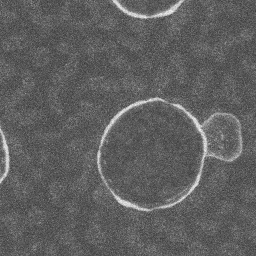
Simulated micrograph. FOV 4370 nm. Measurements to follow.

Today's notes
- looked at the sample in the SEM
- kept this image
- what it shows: raised bodies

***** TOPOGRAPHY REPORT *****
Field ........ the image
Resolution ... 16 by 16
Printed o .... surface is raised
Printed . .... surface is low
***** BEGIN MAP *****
........ooo.....
................
................
................
................
................
.........oo.....
.......ooooo....
.......oooooo...
......ooooooo...
......ooooooo...
.......ooooo....
........ooo.....
................
................
................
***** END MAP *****